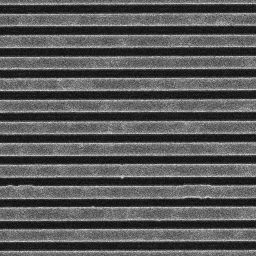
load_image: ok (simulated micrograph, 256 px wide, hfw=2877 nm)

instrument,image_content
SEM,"parallel lines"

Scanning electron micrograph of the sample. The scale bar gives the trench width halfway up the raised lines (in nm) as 87.1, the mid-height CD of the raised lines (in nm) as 154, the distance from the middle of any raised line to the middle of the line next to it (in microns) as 0.242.